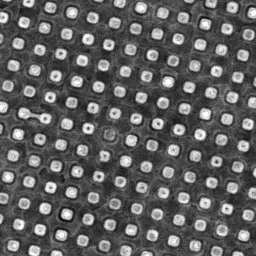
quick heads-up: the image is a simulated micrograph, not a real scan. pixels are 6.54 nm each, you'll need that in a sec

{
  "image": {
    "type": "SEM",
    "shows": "a regular array of raised bodies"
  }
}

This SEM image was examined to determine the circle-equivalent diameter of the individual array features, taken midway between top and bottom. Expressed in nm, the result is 72.7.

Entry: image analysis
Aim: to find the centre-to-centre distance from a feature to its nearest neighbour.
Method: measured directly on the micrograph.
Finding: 141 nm